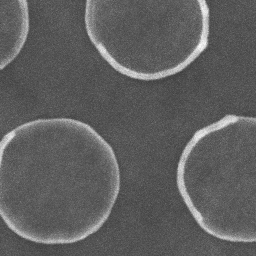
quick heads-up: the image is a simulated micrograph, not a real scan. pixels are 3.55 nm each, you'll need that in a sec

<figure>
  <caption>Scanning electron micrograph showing raised bodies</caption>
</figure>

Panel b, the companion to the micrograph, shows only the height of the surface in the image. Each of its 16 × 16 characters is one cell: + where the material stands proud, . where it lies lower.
++...++++++++...
++...++++++++...
++....+++++++...
+......+++++....
........+++.....
................
................
...+..........++
++++++......++++
+++++++....+++++
+++++++....+++++
+++++++....+++++
+++++++.....++++
+++++++.....++++
.+++++.......+++
................